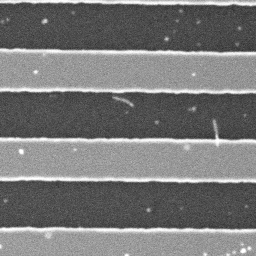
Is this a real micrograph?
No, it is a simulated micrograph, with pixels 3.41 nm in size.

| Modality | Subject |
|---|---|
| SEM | lines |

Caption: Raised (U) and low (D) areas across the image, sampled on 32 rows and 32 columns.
DDDDDDDDDDDDDDDDDDDDDDDDDDDUUUUU
DDDDDDDDDDDDDDDDDDDDDDDDDDDDDDDD
DDDDDDDDDDDDDDDDDDDDDDDDDDDDDDDD
DDDDDDDDDDDDDDDDDDDDDDDDDDDDDDDD
DDDDDDDDDDDDDDDDDDDDDDDDDDDDDDDD
DDDDDDDDDDDDDDDDDDDDDDDDDDDDDDDD
UUUUUUUUUUUUUUUUUUUUUUUDUUDDDDDD
UUUUUUUUUUUUUUUUUUUUUUUUUUUUUUUU
UUUUUUUUUUUUUUUUUUUUUUUUUUUUUUUU
UUUUUUUUUUUUUUUUUUUUUUUUUUUUUUUU
UUUUUUUUUUUUUUUUUUUUUUUUUUUUUUUU
DDDDDDDDDDDDDDUUDDUUUUUUUUUUUUUU
DDDDDDDDDDDDDDDDDDDDDDDDDDDDDDDD
DDDDDDDDDDDDDDDDDDDDDDDDDDDDDDDD
DDDDDDDDDDDDDDDDDDDDDDDDDDDDDDDD
DDDDDDDDDDDDDDDDDDDDDDDDDDDDDDDD
DDDDDDDDDDDDDDDDDDDDDDDDDDDDDDDD
UUUUUUUUUUUUUUUUUUUUUUDDDDDUDDDD
UUUUUUUUUUUUUUUUUUUUUUUUUUUUUUUU
UUUUUUUUUUUUUUUUUUUUUUUUUUUUUUUU
UUUUUUUUUUUUUUUUUUUUUUUUUUUUUUUU
UUUUUUUUUUUUUUUUUUUUUUUUUUUUUUUU
UUUUDUUUUUUUUUUUUUUUUUUUUUUUUUUU
DDDDDDDDDDDDDDDDDDDDDDDDDDDDDDDD
DDDDDDDDDDDDDDDDDDDDDDDDDDDDDDDD
DDDDDDDDDDDDDDDDDDDDDDDDDDDDDDDD
DDDDDDDDDDDDDDDDDDDDDDDDDDDDDDDD
DDDDDDDDDDDDDDDDDDDDDDDDDDDDDDDD
DDDDDDDDDDDDDDDDDDDDDDDDDDDDDDDD
UUUUUUUUUUUUUUUUUUUUUUUUUUUUUUUU
UUUUUUUUUUUUUUUUUUUUUUUUUUUUUUUU
UUUUUUUUUUUUUUUUUUUUUUUUUUUUUUUU